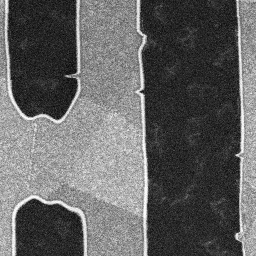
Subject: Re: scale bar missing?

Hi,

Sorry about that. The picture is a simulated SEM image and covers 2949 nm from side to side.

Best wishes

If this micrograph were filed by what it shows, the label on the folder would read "one or a few lines or trenches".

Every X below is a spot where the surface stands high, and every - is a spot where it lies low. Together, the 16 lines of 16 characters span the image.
-----XXXX------X
-----XXXX------X
-----XXXX------X
-----XXXX------X
X----XXXX------X
X----XXXX------X
X----XXXX------X
XXXXXXXXX------X
XXXXXXXXX------X
XXXXXXXXX------X
XXXXXXXXX------X
XXXXXXXXX------X
XX-XXXXXX------X
X----XXXX------X
X----XXXX------X
X----XXXX------X